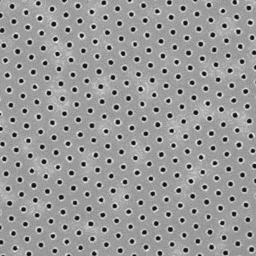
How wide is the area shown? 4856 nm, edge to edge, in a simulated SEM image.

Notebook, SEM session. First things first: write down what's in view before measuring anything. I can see a regular array of holes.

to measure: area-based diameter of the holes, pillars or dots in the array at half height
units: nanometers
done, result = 95.7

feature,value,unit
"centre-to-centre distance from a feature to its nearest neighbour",281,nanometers